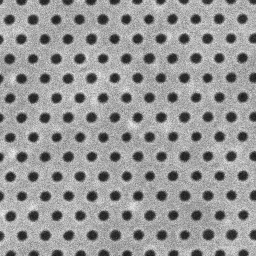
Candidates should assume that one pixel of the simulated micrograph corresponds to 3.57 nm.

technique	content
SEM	a regular array of holes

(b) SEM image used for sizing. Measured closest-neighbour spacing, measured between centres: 80.8 nanometers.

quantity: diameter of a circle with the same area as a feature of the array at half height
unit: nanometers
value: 39.8